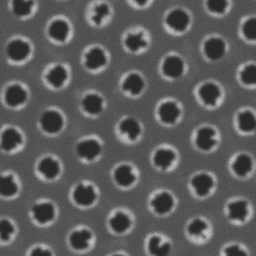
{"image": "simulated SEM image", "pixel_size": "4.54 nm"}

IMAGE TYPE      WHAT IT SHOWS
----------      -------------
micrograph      a regular array of holes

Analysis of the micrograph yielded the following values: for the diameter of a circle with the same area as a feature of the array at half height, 93.7 nanometres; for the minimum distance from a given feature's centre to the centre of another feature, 198 nm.